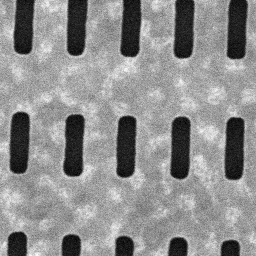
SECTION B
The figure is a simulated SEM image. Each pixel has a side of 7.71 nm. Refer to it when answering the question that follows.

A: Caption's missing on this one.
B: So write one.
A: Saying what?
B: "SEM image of holes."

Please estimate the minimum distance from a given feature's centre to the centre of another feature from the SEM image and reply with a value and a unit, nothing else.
418 nanometers